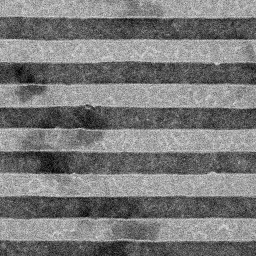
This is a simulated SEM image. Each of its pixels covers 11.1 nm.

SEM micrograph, parallel lines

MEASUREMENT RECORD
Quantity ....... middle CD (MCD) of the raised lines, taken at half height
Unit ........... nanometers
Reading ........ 246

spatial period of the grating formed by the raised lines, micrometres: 0.496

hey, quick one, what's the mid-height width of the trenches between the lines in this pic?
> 246 nanometers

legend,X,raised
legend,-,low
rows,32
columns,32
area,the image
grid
XXXXXXXXXXXXXXXXXXXXXXXXXXXXXXXX
XXXXXXXXXXXXXXXXXXXXXXXXXXXXXXXX
--------------------------------
--------------------------------
--------------------------------
XXXXXXXXXXXXXXXXXXXXXXXXXXXXXXXX
XXXXXXXXXXXXXXXXXXXXXXXXXXXXXXXX
XXXXXXXXXXXXXXXXXXXXXXXXXXXXXXXX
--------------------------------
--------------------------------
--------------------------------
XXXXXXXXXXXXXXXXXXXXXXXXXXXXXXXX
XXXXXXXXXXXXXXXXXXXXXXXXXXXXXXXX
--------------------------------
--------------------------------
--------------------------------
XXXXXXXXXXXXXXXXXXXXXXXXXXXXXXXX
XXXXXXXXXXXXXXXXXXXXXXXXXXXXXXXX
XXXXXXXXXXXXXXXXXXXXXXXXXXXXXXXX
--------------------------------
--------------------------------
--------------------------------
XXXXXXXXXXXXXXXXXXXXXXXXXXXXXXXX
XXXXXXXXXXXXXXXXXXXXXXXXXXXXXXXX
-------XXX----XXX-XXX--X--------
--------------------------------
--------------------------------
XXXXXXXXXXXXXXXXXXXXXXXXXXXXXXXX
XXXXXXXXXXXXXXXXXXXXXXXXXXXXXXXX
XXXXXXXXXXXXXXXXXXXXXXXXXXXXXXXX
--------------------------------
--------------------------------